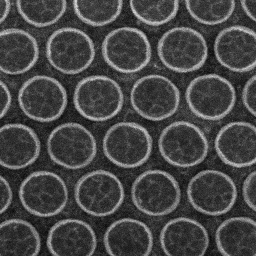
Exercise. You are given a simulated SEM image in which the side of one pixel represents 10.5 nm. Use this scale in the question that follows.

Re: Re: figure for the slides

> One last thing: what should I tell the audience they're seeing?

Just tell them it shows a regular array of raised bodies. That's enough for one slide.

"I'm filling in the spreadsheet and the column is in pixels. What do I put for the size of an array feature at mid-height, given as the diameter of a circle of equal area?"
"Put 44.6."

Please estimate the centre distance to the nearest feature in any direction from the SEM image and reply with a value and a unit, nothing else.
0.576 µm